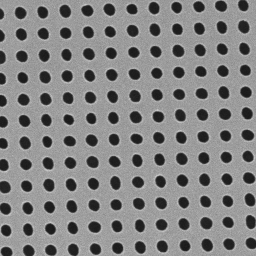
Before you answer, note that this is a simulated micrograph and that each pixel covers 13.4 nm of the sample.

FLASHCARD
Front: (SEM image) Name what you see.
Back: a regular array of holes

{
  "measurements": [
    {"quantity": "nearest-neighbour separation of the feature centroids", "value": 288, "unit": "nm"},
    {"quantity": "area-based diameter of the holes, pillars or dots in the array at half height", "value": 11.8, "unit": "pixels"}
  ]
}